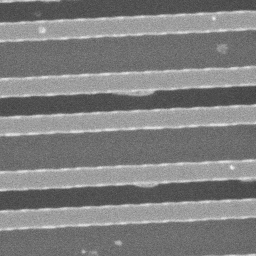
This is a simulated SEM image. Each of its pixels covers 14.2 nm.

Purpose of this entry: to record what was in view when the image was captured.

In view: lines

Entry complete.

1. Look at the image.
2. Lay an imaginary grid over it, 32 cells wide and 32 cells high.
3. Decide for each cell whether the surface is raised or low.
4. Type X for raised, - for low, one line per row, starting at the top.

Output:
--------------------------------
-----------------------------XXX
---------XXXXXXXXXXXXXXXXXXXXXXX
XXXXXXXXXXXXXXXXXXXXXXXXXXXXXXXX
XXXXXXXXXXXXX-------------------
--------------------------------
--------------------------------
--------------------------------
----------------------------XXXX
-------XXXXXXXXXXXXXXXXXXXXXXXXX
XXXXXXXXXXXXXXXXXXXXXXXXXXXXXXXX
XXXXXXXXXXXXXX------------------
--------------------------------
------------------------XXXXXXXX
----XXXXXXXXXXXXXXXXXXXXXXXXXXXX
XXXXXXXXXXXXXXXXXXXXXXXXXXXXXX--
XXXXXXXXXXX---------------------
--------------------------------
--------------------------------
--------------------------------
----------------------XXXXXXXXXX
--XXXXXXXXXXXXXXXXXXXXXXXXXXXXXX
XXXXXXXXXXXXXXXXXXXXXXXXXX------
XXXXXX--------------------------
--------------------------------
--------------------XXXXXXXXXXXX
XXXXXXXXXXXXXXXXXXXXXXXXXXXXXXXX
XXXXXXXXXXXXXXXXXXXXXXXXX-------
XXXX----------------------------
--------------------------------
--------------------------------
--------------------------------